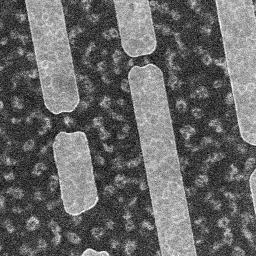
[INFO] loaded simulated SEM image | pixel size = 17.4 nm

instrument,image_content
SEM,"one or a few lines or trenches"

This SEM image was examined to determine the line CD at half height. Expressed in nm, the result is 590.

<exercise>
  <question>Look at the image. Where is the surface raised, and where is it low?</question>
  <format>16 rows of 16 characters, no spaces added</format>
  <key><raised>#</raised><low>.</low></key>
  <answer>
..##...##.....##
..##...###....##
..##....##....##
..##..........##
..###...##....##
...##...##....##
...##...##.....#
.........##....#
....#....##....#
...###...##.....
....##...##.....
....##...##.....
....##...###....
..........##....
..........##....
..........##....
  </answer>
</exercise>